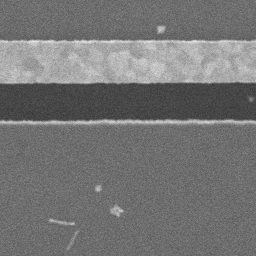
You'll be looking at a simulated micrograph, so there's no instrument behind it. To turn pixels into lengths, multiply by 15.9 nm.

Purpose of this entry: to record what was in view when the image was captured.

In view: lines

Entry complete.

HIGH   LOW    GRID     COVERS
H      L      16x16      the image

HHHHHHHHHHHHHHHH
HHHHHHHHHHHHHHHH
HHHHHHHHHHHHHHHH
HHHHHHHHHHHHHHHH
HHHHHHHHHHHHHHHH
LLLLLLLLLLLLLLLL
LLLLLLLLLLLLLLLL
LLLLLLLLLLLLLLLL
HHHHHHHHHHHHHHHH
HHHHHHHHHHHHHHHH
HHHHHHHHHHHHHHHH
HHHHHHHHHHHHHHHH
HHHHHHHHHHHHHHHH
HHHHHHHHHHHHHHHH
HHHHHHHHHHHHHHHH
HHHHHHHHHHHHHHHH